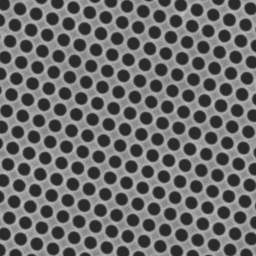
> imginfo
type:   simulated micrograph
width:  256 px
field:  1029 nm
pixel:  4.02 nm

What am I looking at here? a regular array of holes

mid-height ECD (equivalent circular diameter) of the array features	52.3	nanometres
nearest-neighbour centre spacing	67.4	nanometres